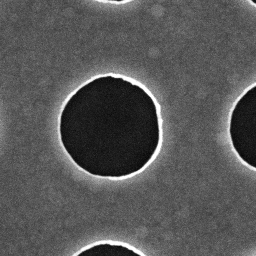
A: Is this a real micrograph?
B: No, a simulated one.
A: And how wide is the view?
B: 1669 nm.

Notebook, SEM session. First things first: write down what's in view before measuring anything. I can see holes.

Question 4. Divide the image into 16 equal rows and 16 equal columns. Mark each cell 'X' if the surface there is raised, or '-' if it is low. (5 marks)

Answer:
XXXXXXXXXXXXXXXX
XXXXXXXXXXXXXXXX
XXXXXXXXXXXXXXXX
XXXXXXXXXXXXXXXX
XXXXXXXXXXXXXXXX
XXXXX----XXXXXXX
XXXX------XXXXX-
XXXX------XXXX--
XXXX------XXXX--
XXXX------XXXXX-
XXXXX----XXXXXXX
XXXXXXXXXXXXXXXX
XXXXXXXXXXXXXXXX
XXXXXXXXXXXXXXXX
XXXXXXXXXXXXXXXX
XXXXXX--XXXXXXXX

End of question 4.